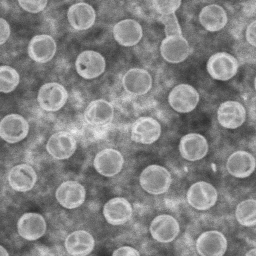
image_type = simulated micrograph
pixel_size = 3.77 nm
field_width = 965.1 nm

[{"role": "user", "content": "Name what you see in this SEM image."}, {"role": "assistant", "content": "a regular array of raised bodies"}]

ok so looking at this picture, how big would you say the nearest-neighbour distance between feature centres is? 186 nanometres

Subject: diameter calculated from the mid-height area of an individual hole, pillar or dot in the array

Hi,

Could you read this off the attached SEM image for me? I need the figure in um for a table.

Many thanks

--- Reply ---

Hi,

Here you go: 0.102